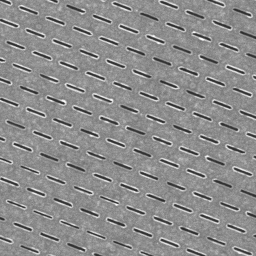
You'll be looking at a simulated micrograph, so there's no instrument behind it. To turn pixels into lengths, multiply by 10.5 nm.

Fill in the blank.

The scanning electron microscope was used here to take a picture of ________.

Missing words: a regular array of holes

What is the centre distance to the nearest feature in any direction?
0.242 um